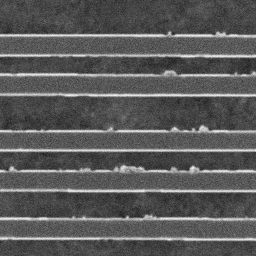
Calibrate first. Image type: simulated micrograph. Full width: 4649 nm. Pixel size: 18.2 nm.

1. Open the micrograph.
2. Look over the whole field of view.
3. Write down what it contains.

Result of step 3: lines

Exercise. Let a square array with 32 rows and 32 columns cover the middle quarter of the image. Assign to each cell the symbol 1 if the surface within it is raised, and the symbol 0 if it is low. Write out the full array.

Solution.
00000000000000000000000000000000
00000000000000000000000000000000
00000000000000000000000001110000
11111111111111111111111111111111
11111111111111111111111111111111
11111111111111111111111111111111
11111111111111111111111111111111
11111111111111111111111111111111
00000000000000000000000000000000
00000000000000000000000000000000
00000000000000000000000000000000
00000000000000000000000000000000
00000000000000000000000000000000
00000000000000000000000000000000
00000000000000000000000000000000
00000000000000000000000000000000
00000000000100000000000000010000
11111111111111111111111111111111
11111111111111111111111111111111
11111111111111111111111111111111
11111111111111111111111111111111
11111111111111111111111111111111
00000000000000000000000000000000
00000000000000000000000000000000
00000000000000000000000000000000
00000000000000000000000000000000
00000000000001111111000000010001
11111111111111111111111111111111
11111111111111111111111111111111
11111111111111111111111111111111
11111111111111111111111111111111
11111111111111111111111111111111